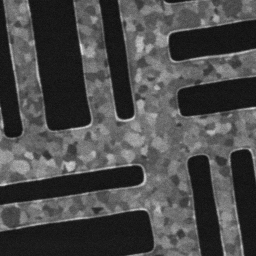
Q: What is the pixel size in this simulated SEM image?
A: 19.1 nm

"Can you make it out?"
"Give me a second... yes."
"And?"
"groups of lines, slits or small figures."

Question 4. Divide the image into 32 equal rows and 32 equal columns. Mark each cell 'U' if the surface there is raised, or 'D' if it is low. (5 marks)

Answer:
UUUUDDDDDUUUDDDUUUUUUUUUUUUUUUUU
DUUUDDDDDUUUDDDUUUUUUUUUUUUUUUUU
DUUUDDDDDDUUUDDUUUUUUUUUUUUUUUUD
DUUUDDDDDDUUUDDUUUUUUUUUUDDDDDDD
DUUUDDDDDDUUUDDDUUUUUDDDDDDDDDDD
DUUUDDDDDDUUUDDDUUUUUDDDDDDDDDDD
DUUUDDDDDDUUUDDDUUUUUDDDDDDDDDDU
DDUUDDDDDDUUUDDDUUUUUUDDUUUUUUUU
DDUUUDDDDDUUUUDDUUUUUUUUUUUUUUUU
DDUUUDDDDDDUUUDDUUUUUUUUUUUUUUUU
DDUUUDDDDDDUUUDDUUUUUUUUUDDDDDDD
DDUUUDDDDDDUUUDDUUUUUUDDDDDDDDDD
DDUUUDDDDDDUUUDDDUUUUUDDDDDDDDDD
DDUUUUDDDDDUUUDDDUUUUUDDDDDDDDDD
DDDUUUDDDDDUUUUDDUUUUUUDUUUUUUUU
DDDUUUDDDDDUUUUUUUUUUUUUUUUUUUUU
DDDUUUUUUUUUUUUUUUUUUUUUUUUUUUUU
UUUUUUUUUUUUUUUUUUUUUUUUUUUUUUUU
UUUUUUUUUUUUUUUUUUUUUUUUUUUUUUUU
UUUUUUUUUUUUUUUUUUUUUUUUDDUUUDDD
UUUUUUUUUUUUUUUUUUUUUUUDDDUUUDDD
UUUUUUUUUUUDDDDDDDUUUUUUDDUUUDDD
UUUUDDDDDDDDDDDDDDUUUUUUDDUUUDDD
DDDDDDDDDDDDDDDDUUUUUUUUDDDUUDDD
DDDDDDDDDUUUUUUUUUUUUUUUDDDUUDDD
DDUUUUUUUUUUUUUUUUUUUUUUDDDUUDDD
UUUUUUUUUUUUUUUDDDUUUUUUDDDUUUDD
UUUUUUUUUDDDDDDDDDDUUUUUDDDUUUDD
UUDDDDDDDDDDDDDDDDDUUUUUDDDDUUDD
DDDDDDDDDDDDDDDDDDDUUUUUUDDDUUDD
DDDDDDDDDDDDDDDDDDDUUUUUUDDDUUDD
DDDDDDDDDDDDDDDDDDDUUUUUUDDDUUDD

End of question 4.